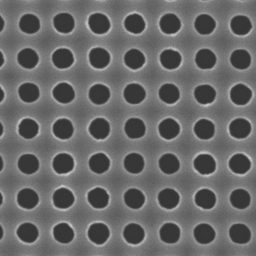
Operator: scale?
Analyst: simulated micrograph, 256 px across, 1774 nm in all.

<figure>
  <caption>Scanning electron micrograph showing a regular array of holes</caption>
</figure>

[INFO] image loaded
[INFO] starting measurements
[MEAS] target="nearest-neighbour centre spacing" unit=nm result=239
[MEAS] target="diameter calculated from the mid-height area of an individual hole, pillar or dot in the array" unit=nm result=143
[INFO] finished